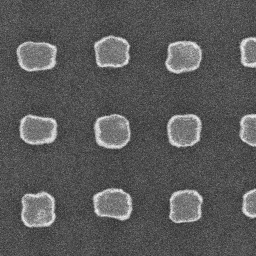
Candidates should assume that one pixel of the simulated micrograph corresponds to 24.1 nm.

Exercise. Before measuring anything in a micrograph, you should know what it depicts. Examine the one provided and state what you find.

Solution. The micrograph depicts a regular array of raised bodies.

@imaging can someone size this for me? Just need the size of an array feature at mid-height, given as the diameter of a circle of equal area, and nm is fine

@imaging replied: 801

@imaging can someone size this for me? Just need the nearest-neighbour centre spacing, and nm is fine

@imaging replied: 1750